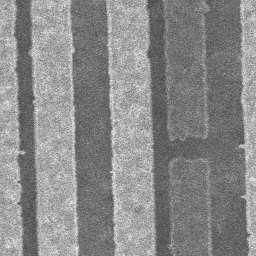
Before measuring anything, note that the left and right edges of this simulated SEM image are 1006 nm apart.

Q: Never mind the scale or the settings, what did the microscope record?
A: one or a few lines or trenches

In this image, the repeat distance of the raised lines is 264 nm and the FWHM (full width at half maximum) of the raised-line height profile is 152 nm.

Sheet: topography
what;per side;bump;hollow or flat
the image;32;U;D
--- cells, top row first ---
UUDDUUUUUDDDDUUUUUDDDUUUUUDDDDUU
UUDDUUUUUDDDDUUUUUDDDUUUUUDDDDUU
UUDDUUUUUDDDDDUUUUUDDUUUUDDDDDUU
UUDDUUUUUDDDDDUUUUDDDUUUUDDDDDUU
UUDDUUUUUDDDDDUUUUDDDUUUUUDDDDUU
UUDDUUUUUDDDDDUUUUUDDUUUUUDDDDUU
UUDDUUUUUDDDDDUUUUDDDUUUUUDDDDUU
UUDDUUUUUDDDDDUUUUDDDUUUUUDDDDUU
UUDDUUUUUDDDDDUUUUUDDUUUUUDDDDUU
UUDDUUUUUDDDDDUUUUUDDUUUUUDDDDUU
UUDDUUUUUDDDDDUUUUUDDUUUUUDDDDUU
UUDDUUUUUDDDDDUUUUUDDUUUUUDDDDUU
UUDDUUUUUDDDDDUUUUUDDUUUUUDDDDUU
UUDDUUUUUDDDDDUUUUUDDUUUUUDDDDDU
UUDDUUUUUDDDDDUUUUUDDUUUUUDDDDDU
UUDDUUUUUDDDDDUUUUUDDUUUUUDDDDDU
UUDDUUUUUDDDDDUUUUUDDUUUUUDDDDDU
UUDDDUUUUDDDDDUUUUUDDDDDDDDDDDDU
UUDDDUUUUDDDDDUUUUUDDDDDDDDDDDDU
UUDDDUUUUDDDDDUUUUUDDDDDDDDDDDDU
UUDDDUUUUDDDDDUUUUUDDUUUUUDDDDDU
UUDDDUUUUDDDDDUUUUUDDUUUUUDDDDDU
UUDDDUUUUDDDDDUUUUUDDUUUUUDDDDDU
UUUDDUUUUDDDDDUUUUUDDUUUUUDDDDDU
UUDDDUUUUDDDDDUUUUUDDUUUUUDDDDDU
UUDDDUUUUDDDDDUUUUUDDUUUUUDDDDDU
UUUDDUUUUDDDDDUUUUUDDUUUUUDDDDDU
UUUDDUUUUDDDDDUUUUUDDUUUUUDDDDDU
UUUDDUUUUUDDDDUUUUUDDUUUUUDDDDDU
UUUDDUUUUUDDDDUUUUUDDUUUUUDDDDDU
UUUDDUUUUUDDDDDUUUUDDUUUUUDDDDDU
UUUDDUUUUUDDDDDUUUUDDDUUUUDDDDDU